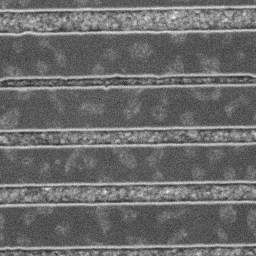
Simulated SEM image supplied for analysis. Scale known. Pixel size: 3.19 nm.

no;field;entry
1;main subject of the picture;parallel lines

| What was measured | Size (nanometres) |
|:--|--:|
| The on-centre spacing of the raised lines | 182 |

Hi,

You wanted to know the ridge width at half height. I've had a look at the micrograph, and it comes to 138 nm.